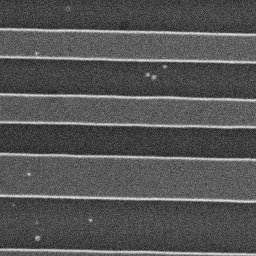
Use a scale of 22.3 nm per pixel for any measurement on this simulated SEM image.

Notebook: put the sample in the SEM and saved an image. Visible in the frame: groups of lines, slits or small figures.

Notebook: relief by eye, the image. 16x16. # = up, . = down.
................
................
################
################
................
................
################
################
................
................
################
################
............####
................
................
................